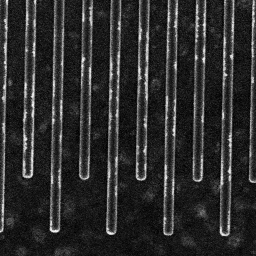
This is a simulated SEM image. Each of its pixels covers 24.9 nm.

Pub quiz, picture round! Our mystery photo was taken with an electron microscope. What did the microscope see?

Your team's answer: parallel lines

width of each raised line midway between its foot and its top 0.24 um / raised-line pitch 704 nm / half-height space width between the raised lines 0.461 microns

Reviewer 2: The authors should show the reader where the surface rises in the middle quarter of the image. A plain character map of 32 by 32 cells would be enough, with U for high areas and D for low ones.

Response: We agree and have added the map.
DDDDUUUDDDDDUUDDDDDUUDDDDDUUDDDD
DDDDUUUDDDDUUUDDDDDUUDDDDDUUDDDD
DDDDUUUDDDDUUUDDDDDUUDDDDDUUDDDD
DDDDUUUDDDDUUUDDDDDUUDDDDDUUDDDD
DDDDUUUDDDDUUUDDDDDUUDUDDDUUDDDD
DDDDUUUDDDDUUUDDDDDUUDDDDDUUDDDD
DDDDUUUDDDDUUUDDDDDUUDDDDDUUDDDD
DDDDUUUDDDDUUUDDDDUUUDDDDDUUDDDD
DDDDUUUDDDDUUUDDDDUUUDDDDDUUDDDD
DDDDUUDDDDDUUUDDDDUUUDDDDDUUDDDD
DDDDUUDDDDDUUUDDDDUUUDDDDDUUDDDD
DDDDUUDDDDDDUDDDDDUUUDDDDDUUDDDD
DDDDUUDDDDDUUDDDDDUUUDDDDDUUDDDD
DDDDUUDDDDDUUDDDDDUUUDDDDDUUDDDD
DDDDUUDDDDDUUDDDDDUUUDDDDDUUDDDD
DDDDUUDDDDDUUDDDDDUUUDDDDDUUDDDD
DDDDUUDDDDDUUDDDDDUUUDDDDUUUDDDD
DDDDUUDDDDDUUDDDDDUUUDDDDUUUDDDD
DDDDUUDDDDDUUDDDDDUUUDDDDUUUDDDD
DDDDUUDDDDDUUDDDDDUUUDDDDUUUDDDD
DDDDUUDDDDDUUDDDDDUUUDDDDUUUDDDD
DDDDUUDDDDDUUDDDDDUUUDDDDUUUDDDD
DDDDUUDDDDDUUDDDDDUUUDDDDUUUDDDD
DDDDUUDDDDDUUDDDDDUUUDDDDUUUDDDD
DDDDUUDDDDDUUDDDDDUUDDDDDUUUDDDD
DDDDUUDDDDDUUDDDDDUUDDDDDUUUDDDD
DDDDUUDDDDDUUDDDDDUUDDDDDUUDDDDD
DDDDUUDDDDDUUDDDDDUUDDDDDUUDDDDD
DDDDUUDDDDDUUDDDDDUUDDDDDUUDDDDD
DDDDDDDDDDDUUDDDDDDDDDDDDUUDDDDD
DDDDDDDDDDDUUDDDDDDDDDDDDUUDDDDD
DDDDDDDDDDDUUDDDDDDDDDDDDUUDDDDD